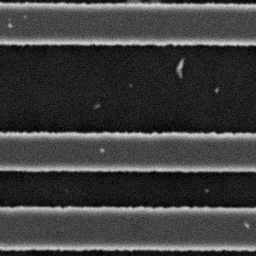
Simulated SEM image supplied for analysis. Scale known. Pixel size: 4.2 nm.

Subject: lines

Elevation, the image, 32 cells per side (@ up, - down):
@@@@@@@@@@@-@@@@@@@@@@@@@@@@@---
@@@@@@@@@@@@@@@@@@@@@@@@@@@@@@@@
@@@@@@@@@@@@@@@@@@@@@@@@@@@@@@@@
@@@@@@@@@@@@@@@@@@@@@@@@@@@@@@@@
@@@@@@@@@@@@@@@@@@@@@@@@@@@@@@@@
@@@@@@@@@@@@@@@@@@@@@@@@@@@@@@@@
--------------------------------
--------------------------------
--------------------------------
--------------------------------
--------------------------------
--------------------------------
--------------------------------
--------------------------------
--------------------------------
--------------------------------
--------------------------------
@@@@@@@@@@@@@@@@@@@@@@@@@@@@@@@@
@@@@@@@@@@@@@@@@@@@@@@@@@@@@@@@@
@@@@@@@@@@@@@@@@@@@@@@@@@@@@@@@@
@@@@@@@@@@@@@@@@@@@@@@@@@@@@@@@@
-----------------------@@------@
--------------------------------
--------------------------------
--------------------------------
--------------------------------
@@@@@@@@@@@@@@@@@@@@@@@@@@@@@@@@
@@@@@@@@@@@@@@@@@@@@@@@@@@@@@@@@
@@@@@@@@@@@@@@@@@@@@@@@@@@@@@@@@
@@@@@@@@@@@@@@@@@@@@@@@@@@@@@@@@
@@@@@@@@@@@@@@@@@@@@@@@@@@@@@@@@
--------------------------------